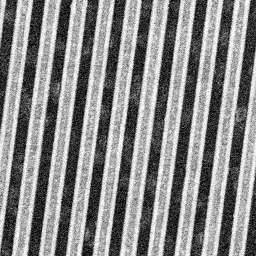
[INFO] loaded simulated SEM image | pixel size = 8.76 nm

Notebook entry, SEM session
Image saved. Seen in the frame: parallel lines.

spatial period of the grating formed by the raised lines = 236 nm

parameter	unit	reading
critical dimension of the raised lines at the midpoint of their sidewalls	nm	93.3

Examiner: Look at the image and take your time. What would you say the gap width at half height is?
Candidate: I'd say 140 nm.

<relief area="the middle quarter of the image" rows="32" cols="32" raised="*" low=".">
.**....***....***....***....**..
***....***....**.....**.....**..
***....***....**....***....***..
***....**.....**....***....***..
***....**.....**....***....***..
**.....**....***....***....***..
**.....**....***....***....**...
**....***....***....***....**...
**....***....***....**.....**...
**....***....**.....**.....**...
**....***....**....***....***...
**....**.....**....***....***...
**....**....***....***....***...
*.....**....***....***....***...
*....***....***....***....**....
*....***....***....***....**....
*....***....**.....**.....**....
*....***....**.....**....***....
*....**.....**....***....***....
*....**.....**....***....***....
*....**....***....***....***....
.....**....***....***....**.....
....***....***....***....**.....
....***....***....**.....**....*
....***....**.....**.....**....*
....***....**....***....***....*
....**.....**....***....***....*
....**.....**....***....***....*
....**....***....***....***....*
....**....***....***....**.....*
...***....***....**.....**.....*
...***....***....**.....**....**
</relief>